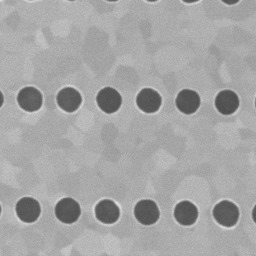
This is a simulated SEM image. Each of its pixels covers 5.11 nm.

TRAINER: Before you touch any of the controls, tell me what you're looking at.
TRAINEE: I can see a regular array of holes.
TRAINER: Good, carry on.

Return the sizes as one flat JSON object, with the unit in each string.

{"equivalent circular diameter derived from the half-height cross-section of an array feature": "135 nm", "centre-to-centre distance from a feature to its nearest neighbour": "39.4 pixels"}